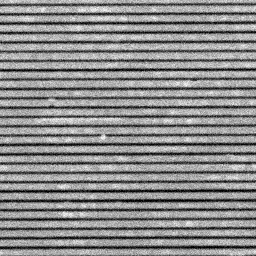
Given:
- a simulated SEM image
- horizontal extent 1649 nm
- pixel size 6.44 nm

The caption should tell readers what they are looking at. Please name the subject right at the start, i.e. parallel lines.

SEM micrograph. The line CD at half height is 40.2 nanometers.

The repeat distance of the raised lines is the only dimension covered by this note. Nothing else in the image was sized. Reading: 0.0601 micrometres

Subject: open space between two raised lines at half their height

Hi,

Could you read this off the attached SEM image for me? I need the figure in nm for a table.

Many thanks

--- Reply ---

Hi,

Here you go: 17.7